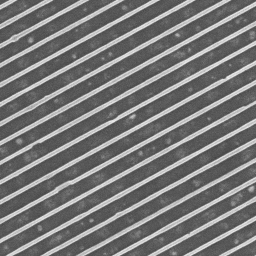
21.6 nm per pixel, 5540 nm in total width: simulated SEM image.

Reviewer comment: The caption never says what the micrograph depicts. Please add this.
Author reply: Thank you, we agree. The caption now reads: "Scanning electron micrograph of parallel lines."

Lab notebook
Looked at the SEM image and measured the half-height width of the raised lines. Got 64 nanometres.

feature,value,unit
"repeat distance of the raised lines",0.37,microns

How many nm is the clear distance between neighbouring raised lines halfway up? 296